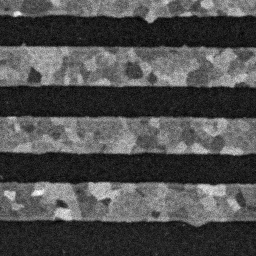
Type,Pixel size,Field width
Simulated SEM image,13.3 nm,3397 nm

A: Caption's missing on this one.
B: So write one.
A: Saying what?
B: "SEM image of one or a few lines or trenches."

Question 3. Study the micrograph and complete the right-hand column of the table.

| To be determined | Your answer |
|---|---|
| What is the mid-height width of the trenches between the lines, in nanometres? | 456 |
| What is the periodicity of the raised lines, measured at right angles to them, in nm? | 901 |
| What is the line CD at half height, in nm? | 455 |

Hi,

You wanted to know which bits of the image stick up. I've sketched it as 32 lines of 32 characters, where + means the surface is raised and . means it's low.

++++++++++++++++++++++++++++++++
++++++++++++++++++++++++++++++++
..................+.............
................................
................................
................................
++++++++++++++++++++++++++++++++
++++++++++++++++++++++++++++++++
++++++++++++++++++++++++++++++++
++++++++++++++++++++++++++++++++
...++..........+...++...++++++++
................................
................................
................................
................................
++++++++++++++++++++++++++++++++
++++++++++++++++++++++++++++++++
++++++++++++++++++++++++++++++++
++++++++++++++++++++++++++++++++
................................
................................
................................
................................
++++++++++++++++++++++++++++++++
++++++++++++++++++++++++++++++++
++++++++++++++++++++++++++++++++
++++++++++++++++++++++++++++++++
.......................++++.....
................................
................................
................................
................................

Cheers